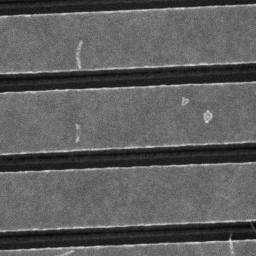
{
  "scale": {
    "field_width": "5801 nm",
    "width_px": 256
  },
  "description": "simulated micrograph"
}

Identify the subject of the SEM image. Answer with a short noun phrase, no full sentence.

lines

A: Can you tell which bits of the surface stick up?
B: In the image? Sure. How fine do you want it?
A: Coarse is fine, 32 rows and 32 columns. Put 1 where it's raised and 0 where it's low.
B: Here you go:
00000000000000000000000000000000
00000000000011111111111111111111
11111111111111111111111111111111
11111111111111111111111111111111
11111111111111111111111111111111
11111111111111111111111111111111
11111111111111111111111111111111
11111111111111111111111111111111
11111111111111111100000000000000
00000000000000000000000000000000
00000000000000000000000001111111
00011111111111111111111111111111
11111111111111111111111111111111
11111111111111111111111111111111
11111111111111111111111111111111
11111111111111111111111111111111
11111111111111111111111111111111
11111111111111111111111111111111
11111111111111111100000000000000
00000000000000000000000000000000
00000000000000000000000000011111
00111111111111111111111111111111
11111111111111111111111111111111
11111111111111111111111111111111
11111111111111111111111111111111
11111111111111111111111111111111
11111111111111111111111111111111
11111111111111111111111111111111
11111111111100000000000000000000
00000000000000000000000000000000
00000000000000000001111111111111
11111111111111111111111111111111